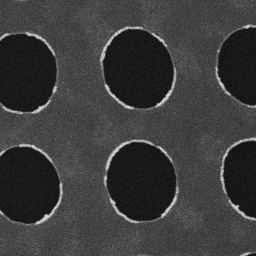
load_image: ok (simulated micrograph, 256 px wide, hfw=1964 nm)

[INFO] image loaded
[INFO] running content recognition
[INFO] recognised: holes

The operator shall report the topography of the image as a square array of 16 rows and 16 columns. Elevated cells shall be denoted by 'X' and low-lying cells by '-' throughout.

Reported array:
XXXXXXXXXXXXXXXX
XXXXXXXXXXXXXXXX
---XXXX---XXXX--
---XXXX----XXX--
----XX-----XXX--
---XXXX----XXX--
---XXXXX--XXXXX-
XXXXXXXXXXXXXXXX
XXXXXXXXXXXXXXXX
--XXXXX---XXXX--
---XXXX----XXX--
----XXX----XXX--
----XXX----XXX--
---XXXXX--XXXXXX
XXXXXXXXXXXXXXXX
XXXXXXXXXXXXXXXX